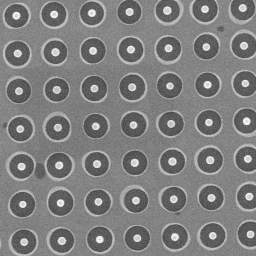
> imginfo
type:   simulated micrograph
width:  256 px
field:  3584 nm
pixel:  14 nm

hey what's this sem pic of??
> an array of small figures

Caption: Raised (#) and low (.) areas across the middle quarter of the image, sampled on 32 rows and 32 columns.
################################
################################
#################.#######...####
######...######.....####.....###
.####.....####......###.......##
.###...#...###..##...##...#...##
.###...#...###...#...##......###
.####......###......####.....###
#####.....#####....######..#####
#######.########################
################################
################################
#######..######....######....###
.#####....#####......###......##
.####......###.......##...##..##
..###..##..###...#...##...#...##
..###......####.....####.....###
.#####....#####.....#####....###
.######..########.##############
################################
################################
#################.########...###
######....######....#####.....##
..###......####......###......##
..###...#..####..#...###..##..##
..###...#..####......###......##
..###......####.....####......##
.#####....######...#######..####
################################
################################
################################
.#######..######....#####.....##